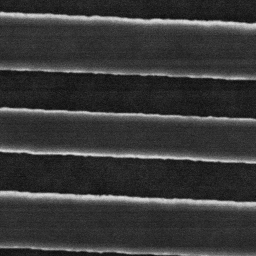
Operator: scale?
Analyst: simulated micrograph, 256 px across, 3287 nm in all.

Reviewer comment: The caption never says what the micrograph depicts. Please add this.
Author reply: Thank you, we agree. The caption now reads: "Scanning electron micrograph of lines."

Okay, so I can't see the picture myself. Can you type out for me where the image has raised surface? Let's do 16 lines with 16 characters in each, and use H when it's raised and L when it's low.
LLLLLLLLLLLLLLLL
HHHHHHHHHHHHHHHL
HHHHHHHHHHHHHHHH
HHHHHHHHHHHHHHHH
LLLLHHHHHHHHHHHH
LLLLLLLLLLLLLLLL
LLLLLLLLLLLLLLLL
HHHHHHHHHHHHHHHH
HHHHHHHHHHHHHHHH
LHHHHHHHHHHHHHHH
LLLLLLLLLLLLLLLL
LLLLLLLLLLLLLLLL
HHHHHHHHHHHHLLLL
HHHHHHHHHHHHHHHH
HHHHHHHHHHHHHHHH
LHHHHHHHHHHHHHHH